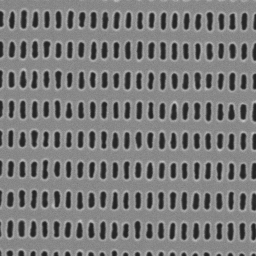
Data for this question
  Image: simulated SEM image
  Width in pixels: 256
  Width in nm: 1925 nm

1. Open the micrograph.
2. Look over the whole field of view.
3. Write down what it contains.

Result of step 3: a regular array of holes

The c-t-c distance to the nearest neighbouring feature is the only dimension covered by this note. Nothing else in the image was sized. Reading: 86.2 nm